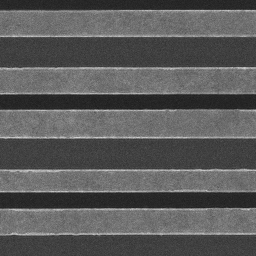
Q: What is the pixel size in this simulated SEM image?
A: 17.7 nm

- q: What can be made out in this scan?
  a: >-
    lines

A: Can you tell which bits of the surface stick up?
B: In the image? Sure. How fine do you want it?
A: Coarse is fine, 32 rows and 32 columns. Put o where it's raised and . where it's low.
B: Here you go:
................................
oooooooooooooooooooooooooooooooo
oooooooooooooooooooooooooooooooo
oooooooooooooooooooooooooooooooo
oooooooooooooooooooooooooooooooo
................................
................................
................................
...ooo.ooooooooooooooooooooooooo
oooooooooooooooooooooooooooooooo
oooooooooooooooooooooooooooooooo
oooooooooooooooooooooooooooooooo
................................
................................
oooooooooooooooooooooooooooooooo
oooooooooooooooooooooooooooooooo
oooooooooooooooooooooooooooooooo
................................
................................
................................
................................
oooooooooooooooooooooooooooooooo
oooooooooooooooooooooooooooooooo
oooooooooooooooooooooooooooooooo
................................
................................
oooooooooooooooooooooooooooooooo
oooooooooooooooooooooooooooooooo
oooooooooooooooooooooooooooooooo
................................
................................
................................